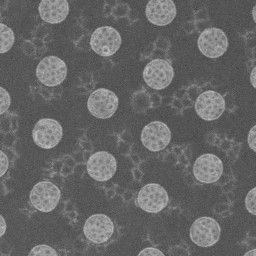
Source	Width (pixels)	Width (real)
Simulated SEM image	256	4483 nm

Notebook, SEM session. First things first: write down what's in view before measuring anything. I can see a regular array of raised bodies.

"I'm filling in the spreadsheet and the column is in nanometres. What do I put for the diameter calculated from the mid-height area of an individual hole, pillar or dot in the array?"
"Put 496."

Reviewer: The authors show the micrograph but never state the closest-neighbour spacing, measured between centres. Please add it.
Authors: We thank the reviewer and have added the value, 1070 nm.